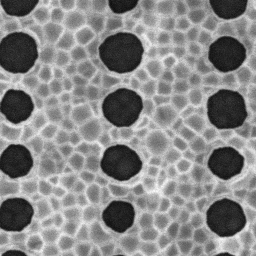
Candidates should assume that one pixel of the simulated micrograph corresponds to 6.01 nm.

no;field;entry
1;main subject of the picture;a regular array of holes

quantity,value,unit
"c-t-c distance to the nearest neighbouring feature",325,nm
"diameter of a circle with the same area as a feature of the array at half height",238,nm